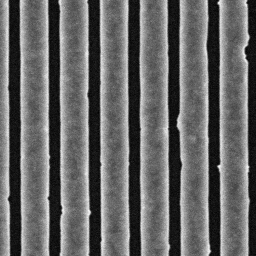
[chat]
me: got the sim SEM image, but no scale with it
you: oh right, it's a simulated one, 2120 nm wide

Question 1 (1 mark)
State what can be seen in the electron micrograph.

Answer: parallel lines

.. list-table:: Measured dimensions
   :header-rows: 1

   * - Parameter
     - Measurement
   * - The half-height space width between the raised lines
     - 101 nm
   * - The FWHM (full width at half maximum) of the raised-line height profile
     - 0.234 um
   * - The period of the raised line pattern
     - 330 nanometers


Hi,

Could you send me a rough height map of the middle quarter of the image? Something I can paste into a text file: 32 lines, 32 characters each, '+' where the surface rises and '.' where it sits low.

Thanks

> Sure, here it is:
++++++...+++++++...+++++++...+++
++++++...+++++++...+++++++...+++
++++++...+++++++...+++++++...+++
++++++...+++++++...+++++++...+++
++++++...+++++++...+++++++...+++
++++++...+++++++...+++++++...+++
++++++...+++++++...+++++++...+++
++++++...+++++++...+++++++...+++
++++++...+++++++...+++++++...+++
++++++...+++++++...+++++++...+++
++++++...+++++++...+++++++...+++
++++++...+++++++...+++++++...+++
++++++...+++++++...+++++++...+++
++++++...+++++++...+++++++...+++
++++++...+++++++...+++++++..++++
++++++...+++++++...+++++++..++++
++++++...+++++++...+++++++...+++
++++++...+++++++...+++++++...+++
++++++...+++++++...+++++++...+++
++++++...+++++++...+++++++...+++
++++++...+++++++...+++++++...+++
++++++...+++++++...+++++++...+++
++++++...+++++++...+++++++...+++
++++++...+++++++...+++++++...+++
++++++...+++++++...+++++++...+++
++++++...+++++++...+++++++...+++
++++++...+++++++...+++++++...+++
++++++...+++++++...+++++++...+++
++++++...+++++++...+++++++...+++
++++++...+++++++...+++++++...+++
++++++...+++++++...+++++++...+++
++++++...+++++++...+++++++...+++